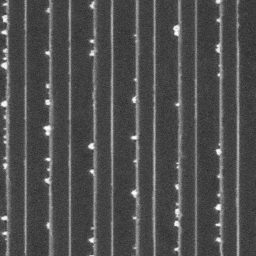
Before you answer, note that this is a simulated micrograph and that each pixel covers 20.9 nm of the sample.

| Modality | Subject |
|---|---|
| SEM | lines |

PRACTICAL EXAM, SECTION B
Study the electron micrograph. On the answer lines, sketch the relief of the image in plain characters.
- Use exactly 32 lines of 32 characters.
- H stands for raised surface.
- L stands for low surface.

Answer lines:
LHHLLLHHHLLLHHLLLHHLLLHHLLLLHHLL
LHHLLLHHHLLLHHLLLHHLLLHHLLLLHHLL
LHHLLLHHHLLLHHLLLHHLLLHHLLLLHHLL
LHHLLLHHHLLLHHLLLHHLLLHHLLLLHHLL
LHHLLLHHHLLLHHLLLHHLLLHHLLLLHHLL
LHHLLLHHHLLLHHLLLHHLLLHHLLLLHHLL
LHHLLLHHHLLLHHLLLHHLLLHHLLLLHHLL
LHHLLLHHHLLLHHLLLHHLLLHHLLLLHHLL
LHHLLLHHHLLLHHLLLHHLLLHHLLLLHHLL
LHHLLLHHHLLLHHLLLHHLLLHHLLLLHHLL
LHHLLLHHHLLLHHLLLHHLLLHHLLLLHHLL
LHHLLLHHHLLLHHLLLHHLLLHHLLLLHHLL
LHHLLLHHHLLLHHLLLHHLLLHHLLLLHHLL
LHHLLLHHHLLLHHLLLHHLLLHHLLLLHHLL
LHHLLLHHHLLLHHLLLHHLLLHHLLLLHHLL
LHHLLLHHHLLLHHLLLHHLLLHHLLLLHHLL
LHHLLLHHHLLLHHLLLHHLLLHHLLLLHHLL
LHHLLLHHHLLLHHLLLHHLLLHHLLLLHHLL
LHHLLLHHHLLLHHLLLHHLLLHHLLLLHHLL
LHHLLLHHHLLLHHLLLHHLLLHHLLLLHHLL
LHHLLLHHHLLLHHLLLHHLLLHHLLLLHHLL
LHHLLLHHHLLLHHLLLHHLLLHHLLLLHHLL
LHHLLLHHHLLLHHLLLHHLLLHHLLLLHHLL
LHHLLLHHHLLLHHLLLHHLLLHHLLLLHHLL
LHHLLLHHHLLLHHLLLHHLLLHHLLLLHHLL
LHHLLLHHHLLLHHLLLHHLLLHHLLLLHHLL
LHHLLLHHHLLLHHLLLHHLLLHHLLLLHHLL
LHHLLLHHHLLLHHLLLHHLLLHHLLLLHHLL
LHHLLLHHHLLLHHLLLHHLLLHHLLLLHHLL
LHHLLLHHHLLLHHLLLHHLLLHHLLLLHHLL
LHHLLLHHHLLLHHLLLHHLLLHHLLLLHHLL
LHHLLLHHHLLLHHLLLHHLLLHHLLLLHHLL